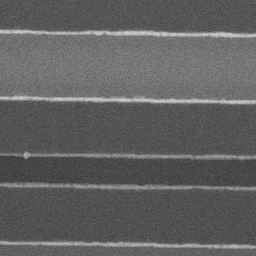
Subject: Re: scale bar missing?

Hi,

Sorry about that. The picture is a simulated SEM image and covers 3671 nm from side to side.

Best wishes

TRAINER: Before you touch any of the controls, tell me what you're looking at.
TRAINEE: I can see lines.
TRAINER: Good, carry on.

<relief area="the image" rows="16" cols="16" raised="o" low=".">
oooooooooooooooo
oooooooooooooooo
................
................
................
................
oooooooooooooooo
oooooooooooooooo
oooooooooooooooo
oooooooooooooooo
................
................
oooooooooooooooo
oooooooooooooooo
oooooooooooooooo
................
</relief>